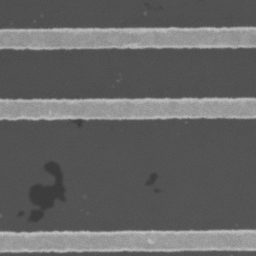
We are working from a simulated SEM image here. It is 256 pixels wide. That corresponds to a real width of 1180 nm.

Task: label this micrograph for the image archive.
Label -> lines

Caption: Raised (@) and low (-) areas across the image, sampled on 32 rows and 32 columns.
--------------------------------
--------------------------------
--------------------------------
---------------------@----@-@@@@
@@@@@@@@@@@@@@@@@@@@@@@@@@@@@@@@
@@@@@@@@@@@@@@@@@@@@@@@@@@@@@@@@
--------------------------------
--------------------------------
--------------------------------
--------------------------------
--------------------------------
--------------------------------
-----------@@-@@@@@@@@@@@@@@@@@@
@@@@@@@@@@@@@@@@@@@@@@@@@@@@@@@@
@@@@@@@@@@@@@@@@@@@@@@@@@@@@@@@@
--------------------------------
--------------------------------
--------------------------------
--------------------------------
--------------------------------
--------------------------------
--------------------------------
--------------------------------
--------------------------------
--------------------------------
--------------------------------
--------------------------------
--------------------------------
--------------------------------
@@@@@@@@@@@@@@@@@@@@@@@@@@@@@@@@
@@@@@@@@@@@@@@@@@@@@@@@@@@@@@@@@
--------------------------------